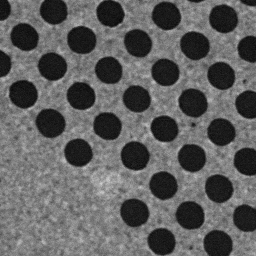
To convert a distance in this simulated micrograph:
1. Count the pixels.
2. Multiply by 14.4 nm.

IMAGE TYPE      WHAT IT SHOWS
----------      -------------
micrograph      a regular array of holes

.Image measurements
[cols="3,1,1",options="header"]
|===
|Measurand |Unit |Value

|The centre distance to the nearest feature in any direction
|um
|0.564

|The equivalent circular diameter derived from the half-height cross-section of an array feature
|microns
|0.423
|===